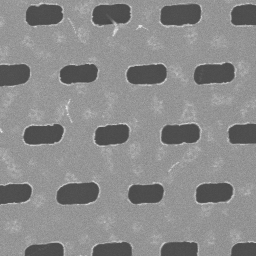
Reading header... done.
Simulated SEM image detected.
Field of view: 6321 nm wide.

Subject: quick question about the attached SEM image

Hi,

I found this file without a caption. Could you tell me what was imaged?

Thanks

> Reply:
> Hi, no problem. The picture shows a regular array of holes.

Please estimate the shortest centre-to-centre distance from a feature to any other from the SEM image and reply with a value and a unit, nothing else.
1670 nm